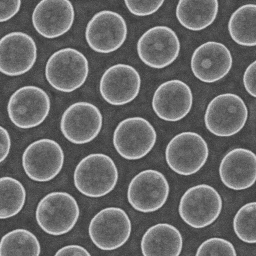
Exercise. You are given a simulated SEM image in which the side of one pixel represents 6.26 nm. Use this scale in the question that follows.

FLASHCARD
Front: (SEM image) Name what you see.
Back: a regular array of raised bodies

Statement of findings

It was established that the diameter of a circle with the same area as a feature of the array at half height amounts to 253 nanometres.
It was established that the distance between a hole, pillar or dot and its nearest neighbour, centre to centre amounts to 0.336 um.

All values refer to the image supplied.